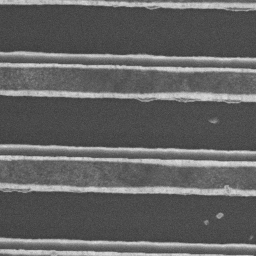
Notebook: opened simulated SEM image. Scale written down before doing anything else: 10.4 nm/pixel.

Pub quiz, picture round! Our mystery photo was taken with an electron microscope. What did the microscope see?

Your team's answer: lines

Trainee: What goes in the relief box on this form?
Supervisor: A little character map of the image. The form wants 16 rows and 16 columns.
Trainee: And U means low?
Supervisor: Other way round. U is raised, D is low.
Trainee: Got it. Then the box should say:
DDDDDDDDDUDDDDUU
DDDDDDDDDDDDDDDD
DDDDDDDDDDDDDDDD
UUUUUUDDDDDDDDDD
UUUUUUUUUUUUUUUU
UUUUUUUUUUUUUUUU
DDDDDDDDDDDDDDDD
DDDDDDDDDDDDDDDD
DDDDDDDDDDDDDDDD
UUUUUUUUUUUUUUUD
UUUUUUUUUUUUUUUU
UUUUUUUUUUUUUUUU
DDDDDDDDDDDDDDDD
DDDDDDDDDDDDDDDD
DDDDDDDDDDDDDDDD
UUUUUUUUUUUUUUUU